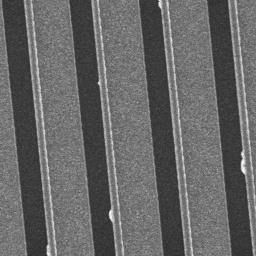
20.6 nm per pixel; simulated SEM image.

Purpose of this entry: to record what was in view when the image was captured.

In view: lines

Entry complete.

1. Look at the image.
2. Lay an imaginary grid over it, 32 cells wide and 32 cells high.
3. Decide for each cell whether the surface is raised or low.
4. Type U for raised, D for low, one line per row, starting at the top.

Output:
DDDUUUUUUDDUUUUUUDDDUUUUUUDDDUUU
DDDUUUUUUDDDUUUUUDDDUUUUUUDDDUUU
DDDUUUUUUDDDUUUUUUDDUUUUUUDDDUUU
UDDUUUUUUDDDUUUUUUDDUUUUUUDDDUUU
UDDUUUUUUDDDUUUUUUDDUUUUUUDDDUUU
UDDDUUUUUDDDUUUUUUDDDUUUUUDDDUUU
UDDDUUUUUDDDUUUUUUDDDUUUUUDDDUUU
UDDDUUUUUDDDUUUUUUDDDUUUUUUDDUUU
UDDDUUUUUDDDUUUUUUDDDUUUUUUDDUUU
UDDDUUUUUUDDUUUUUUDDDUUUUUUDDDUU
UDDDUUUUUUDDUUUUUUDDDUUUUUUDDDUU
UDDDUUUUUUDDDUUUUUDDDUUUUUUDDDUU
UDDDUUUUUUDDDUUUUUUDDUUUUUUDDDUU
UUDDUUUUUUDDDUUUUUUDDUUUUUUDDDUU
UUDDUUUUUUDDDUUUUUUDDUUUUUUDDDUU
UUDDDUUUUUDDDUUUUUUDDDUUUUUDDDUU
UUDDDUUUUUDDDUUUUUUDDDUUUUUDDDUU
UUDDDUUUUUDDDUUUUUUDDDUUUUUDDDUU
UUDDDUUUUUDDDUUUUUUDDDUUUUUUDDUU
UUDDDUUUUUUDDUUUUUUDDDUUUUUUDDUU
UUDDDUUUUUUDDUUUUUUDDDUUUUUUDDUU
UUDDDUUUUUUDDDUUUUUDDDUUUUUUDDUU
UUDDDUUUUUUDDDUUUUUDDDUUUUUUDDDU
UUUDDUUUUUUDDDUUUUUUDDUUUUUUDDDU
UUUDDUUUUUUDDDUUUUUUDDUUUUUUDDDU
UUUDDDUUUUUDDDUUUUUUDDDUUUUUDDDU
UUUDDDUUUUUDDDUUUUUUDDDUUUUUDDDU
UUUDDDUUUUUDDDUUUUUUDDDUUUUUDDDU
UUUDDDUUUUUDDDUUUUUUDDDUUUUUUDDU
UUUDDDUUUUUDDDUUUUUUDDDUUUUUUDDU
UUUDDDUUUUUUDDUUUUUUDDDUUUUUUDDD
UUUDDDUUUUUUDDUUUUUUDDDUUUUUUDDD